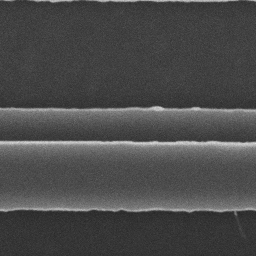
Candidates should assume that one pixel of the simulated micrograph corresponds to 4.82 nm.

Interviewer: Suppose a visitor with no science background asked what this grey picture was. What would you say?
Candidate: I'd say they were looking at lines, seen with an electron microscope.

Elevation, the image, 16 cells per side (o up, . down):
................
................
................
................
................
................
................
................
............oo..
oooooooooooooooo
oooooooooooooooo
oooooooooooooooo
oooooooooooooooo
................
................
................